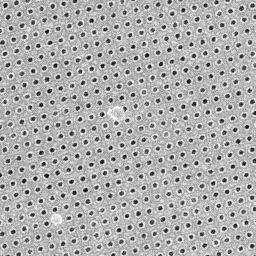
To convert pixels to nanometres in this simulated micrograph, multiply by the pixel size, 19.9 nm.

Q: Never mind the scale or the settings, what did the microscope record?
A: a regular array of holes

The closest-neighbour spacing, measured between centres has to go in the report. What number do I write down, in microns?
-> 0.225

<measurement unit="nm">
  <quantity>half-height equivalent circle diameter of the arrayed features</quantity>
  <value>108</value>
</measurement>